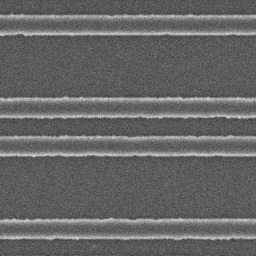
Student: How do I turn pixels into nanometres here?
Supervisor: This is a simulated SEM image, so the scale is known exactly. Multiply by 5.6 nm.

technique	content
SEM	lines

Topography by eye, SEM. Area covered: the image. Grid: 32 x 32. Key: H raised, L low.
LLLLLLLLLLLLLLLLLLLLLLLLLLLLLLLL
LLLLLLLLLLLLLLLLLLLLLLLLLLLLLLLL
HHHHHHHHHHHHHHHHHHHHHHHHHHHHHHHH
HHHHHHHHHHHHHHHHHHHHHHHHHHHHHHHH
LLLLLLLLLLLLLLLLLLLLLLLLLLLLLLLL
LLLLLLLLLLLLLLLLLLLLLLLLLLLLLLLL
LLLLLLLLLLLLLLLLLLLLLLLLLLLLLLLL
LLLLLLLLLLLLLLLLLLLLLLLLLLLLLLLL
LLLLLLLLLLLLLLLLLLLLLLLLLLLLLLLL
LLLLLLLLLLLLLLLLLLLLLLLLLLLLLLLL
LLLLLLLLLLLLLLLLLLLLLLLLLLLLLLLL
LLLLLLLLLLLLLLLLLLLLLLLLLLLLLLLL
HHHHHHHHHHHHHHHHHHHHHHHHHHHHHHHH
HHHHHHHHHHHHHHHHHHHHHHHHHHHHHHHH
HHHHHHHHHHHHHHHHHHHHHHHHHHHHHHHH
LLLLLLLLLLLLLLLLLLLLLLLLLLLLLLLL
LLLLLLLLLLLLLLLLLLLLLLLLLLLLLLLL
HHHHHHHHHHHHHHHHHHHHHHHHHHHHHHHH
HHHHHHHHHHHHHHHHHHHHHHHHHHHHHHHH
LLLLHLLLHHLLLLLLLLLLLLLLLLLLLLLL
LLLLLLLLLLLLLLLLLLLLLLLLLLLLLLLL
LLLLLLLLLLLLLLLLLLLLLLLLLLLLLLLL
LLLLLLLLLLLLLLLLLLLLLLLLLLLLLLLL
LLLLLLLLLLLLLLLLLLLLLLLLLLLLLLLL
LLLLLLLLLLLLLLLLLLLLLLLLLLLLLLLL
LLLLLLLLLLLLLLLLLLLLLLLLLLLLLLLL
LLLLLLLLLLLLLLLLLLLLLLLLLLLLLLLL
LHHHHHHHHHHHHHHHLHHHHHHHHHHHHHHH
HHHHHHHHHHHHHHHHHHHHHHHHHHHHHHHH
HHHHHHHHHHHHHHHHHHHHHHHHHHHHHHHH
LLLLLLLLLLLLLLLLLLLLLLLLLLLLLLLL
LLLLLLLLLLLLLLLLLLLLLLLLLLLLLLLL